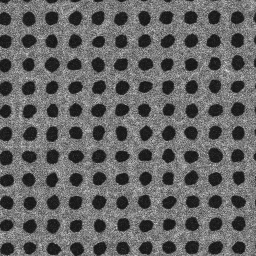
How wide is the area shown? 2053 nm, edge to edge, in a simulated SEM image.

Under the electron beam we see a regular array of holes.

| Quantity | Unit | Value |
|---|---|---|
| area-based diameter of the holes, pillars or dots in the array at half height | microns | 0.107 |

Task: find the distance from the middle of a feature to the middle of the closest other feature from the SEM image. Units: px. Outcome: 22.5